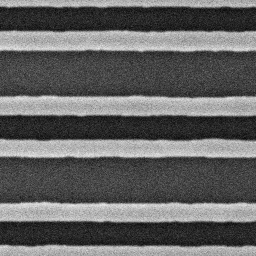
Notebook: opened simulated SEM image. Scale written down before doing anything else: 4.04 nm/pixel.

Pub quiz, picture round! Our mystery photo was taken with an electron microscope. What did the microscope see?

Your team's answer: lines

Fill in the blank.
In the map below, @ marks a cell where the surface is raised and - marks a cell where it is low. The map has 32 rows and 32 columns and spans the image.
@@@@@@@@@@@@@@@@@@@@@@@@@@@@@@@@
--------------------------------
--------------------------------
--------------------------------
@@@@@@@@@@@@@@@@@@@@@@@@@@@@@@@@
@@@@@@@@@@@@@@@@@@@@@@@@@@@@@@@@
--------------------------------
--------------------------------
--------------------------------
--------------------------------
--------------------------------
--------------------------------
@@@@@@@@@@@@@@@@@@@@@@@@@@@@@@@@
@@@@@@@@@@@@@@@@@@@@@@@@@@@@@@@@
--------------------------------
--------------------------------
--------------------------------
@------------------------@@@----
@@@@@@@@@@@@@@@@@@@@@@@@@@@@@@@@
--@@@@@@-@@@@--@@@@@@----@@@@@@@
--------------------------------
--------------------------------
--------------------------------
--------------------------------
--------------------------------
--@@@@@@----@@-------@@--@---@@-
@@@@@@@@@@@@@@@@@@@@@@@@@@@@@@@@
@@@@@@@@@@@@@@@@@@@@@@@@@@@@@@@@
--------------------------------
--------------------------------
--------------------------------
@@@@@@@@@@@@@@@@@@@@@@@@@@@@@@@@